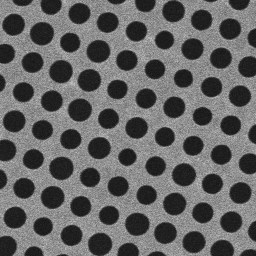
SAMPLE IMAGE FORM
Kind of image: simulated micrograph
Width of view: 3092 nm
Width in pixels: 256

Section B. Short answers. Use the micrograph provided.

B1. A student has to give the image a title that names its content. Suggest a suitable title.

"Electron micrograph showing a regular array of holes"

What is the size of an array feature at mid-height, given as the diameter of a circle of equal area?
256 nm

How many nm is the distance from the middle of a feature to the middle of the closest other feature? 357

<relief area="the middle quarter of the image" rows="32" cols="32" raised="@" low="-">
--@@@@@@@@@@@-----@@-----@@@@@@@
--@@@---@@@@@@---@@@-----@@@@--@
--@@-----@@@@@@@@@@@-----@@@----
--@------@@@@@@@@@@@@@--@@@-----
-@@------@@@---@@@@@@@@@@@@-----
@@@@-----@@-----@@@@@@@@@@@@---@
@@@@@---@@@-----@@@---@@@@@@@@@@
@@@@@@@@@@@-----@@-----@@@@@@@@@
@@@@@@@@@@@@--@@@@-----@@@---@@@
@@----@@@@@@@@@@@@-----@@-----@@
@------@@@@@@@@@@@@---@@@-----@@
@------@@@--@@@@@@@@@@@@@-----@@
@------@@----@@@@@@@@@@@@-----@@
@@----@@@-----@@@--@@@@@@@@-@@@@
@@@@@@@@@-----@@-----@@@@@@@@@@@
@@@@@@@@@----@@------@@@@@@@@@@@
@--@@@@@@@@@@@@------@@@---@@@@@
----@@@@@@@@@@@@----@@@-----@@@@
----@@@@--@@@@@@@--@@@@-----@@@-
----@@-----@@@@@@@@@@@@----@@@--
---@@@------@@@@@@@@@@@@@-@@@@--
@@@@@@------@@@--@@@@@@@@@@@@@--
@@@@@@-----@@@----@@@@@@@@@@@@@-
-@@@@@@---@@@@----@@@@--@@@@@@@@
--@@@@@@@@@@@@----@@@----@@@@@@@
--@@@@@@@@@@@@@-@@@@-----@@@----
--@@@---@@@@@@@@@@@@@----@@-----
--@@-----@@@@@@@@@@@@---@@@-----
-@@@-----@@@---@@@@@@@@@@@@-----
@@@@-----@@-----@@@@@@@@@@@@----
@@@@@---@@@-----@@@@--@@@@@@@--@
@@@@@@@@@@@-----@@-----@@@@@@@@@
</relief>